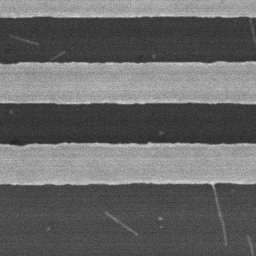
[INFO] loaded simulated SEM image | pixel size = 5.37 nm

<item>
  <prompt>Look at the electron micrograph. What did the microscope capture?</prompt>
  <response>lines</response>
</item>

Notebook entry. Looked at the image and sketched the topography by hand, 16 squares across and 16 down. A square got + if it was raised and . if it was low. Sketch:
++++++++++++++++
................
................
................
++++++++++++++++
++++++++++++++++
................
................
................
++++++++++++++++
++++++++++++++++
++++++++........
................
................
................
................